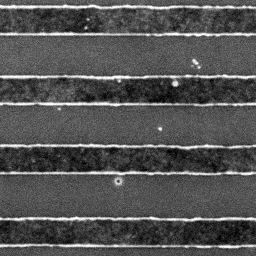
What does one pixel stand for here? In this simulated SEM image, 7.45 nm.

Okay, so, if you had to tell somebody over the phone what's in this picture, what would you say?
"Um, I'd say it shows lines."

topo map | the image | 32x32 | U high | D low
DDDDDDDDDDDDDDDDDDDDDDDDDDDDDDDD
UUUUUUUUUUUUUUUUUUUUUUUUUUUUUUUU
UUUUUUUUUUUUUUUUUUUUUUUUUUUUUUUU
UUUUUUUUUUUUUUUUUUUUUUUUUUUUUUUU
DDDDDDDDDDDDDDDDDDDDDDDDDDDDDDDD
DDDDDDDDDDDDDDDDDDDDDDDDDDDDDDDD
DDDDDDDDDDDDDDDDDDDDDDDDDDDDDDDD
DDDDDDDDDDDDDDDDDDDDDDDDDDDDDDDD
DDDDDDDDDDDDDDDDDDDDDDDDDDDDDDDD
DDDDDDDDUDDDDDDDDDDDDDDUDDDUUDDD
UUUUUUUUUUUUUUUUUUUUUUUUUUUUUUUU
UUUUUUUUUUUUUUUUUUUUUUUUUUUUUUUU
UUUUUUUUUUUUUUUUUUUUUUUUUUUUUUUU
DDDDDDDDDDDDDDDDDDDDDDDDDDDDDDDD
DDDDDDDDDDDDDDDDDDDDDDDDDDDDDDDD
DDDDDDDDDDDDDDDDDDDDDDDDDDDDDDDD
DDDDDDDDDDDDDDDDDDDDDDDDDDDDDDDD
DDDDDDDDDDDDDDDDDDDDDDDDDDDDDDDD
UUUUUUUUUUUUUUUUUUUUUUUUUUUUUUUU
UUUUUUUUUUUUUUUUUUUUUUUUUUUUUUUU
UUUUUUUUUUUUUUUUUUUUUUUUUUUUUUUU
UUUUUUUUUUUUUUUUUUUUUUUUUUUUUUUU
DDDDDDDDDDDDDDDDDDDDDDDDDDDDDDDD
DDDDDDDDDDDDDDDDDDDDDDDDDDDDDDDD
DDDDDDDDDDDDDDDDDDDDDDDDDDDDDDDD
DDDDDDDDDDDDDDDDDDDDDDDDDDDDDDDD
DDDDDDDDDDDDDDDDDDDDDDDDDDDDDDDD
UUUUUUUUUUUUUUUUUUUUUUUUUUUUUUUU
UUUUUUUUUUUUUUUUUUUUUUUUUUUUUUUU
UUUUUUUUUUUUUUUUUUUUUUUUUUUUUUUU
UUUUUUUUUUUUUUUUUUUUUUUUUUUUUUUU
DDDDDDDDDDDDDDDDDDDDDDDDDDDDDDDD